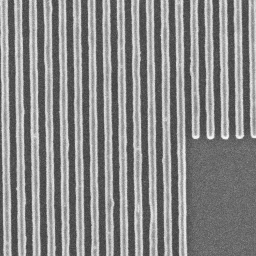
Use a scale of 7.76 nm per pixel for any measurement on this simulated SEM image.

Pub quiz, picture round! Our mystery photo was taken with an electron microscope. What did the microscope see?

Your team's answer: parallel lines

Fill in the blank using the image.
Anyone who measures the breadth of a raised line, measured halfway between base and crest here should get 45.6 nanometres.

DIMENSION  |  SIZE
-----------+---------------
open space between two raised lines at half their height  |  68.8 nanometers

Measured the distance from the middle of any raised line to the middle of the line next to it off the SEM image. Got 114 nm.